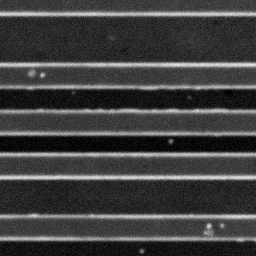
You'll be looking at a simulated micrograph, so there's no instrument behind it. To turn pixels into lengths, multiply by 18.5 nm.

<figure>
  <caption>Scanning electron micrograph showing lines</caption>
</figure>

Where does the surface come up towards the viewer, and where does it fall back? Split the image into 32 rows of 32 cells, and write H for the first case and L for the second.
HHHHHHHHHHHHHHHHHHHHHHHHHHHHHHHH
HHHHHHHHHHHHHHHHHHHHHHHHHHHHHHHH
LLLLLLLLLLLLLLLLLLLLLLLLLLLLLLLL
LLLLLLLLLLLLLLLLLLLLLLLLLLLLLLLL
LLLLLLLLLLLLLLLLLLLLLLLLLLLLLLLL
LLLLLLLLLLLLLLLLLLLLLLLLLLLLLLLL
LLLLLLLLLLLLLLLLLLLLLLLLLLLLLLLL
LLLLLLLLLLLLLLLLLLLLLLLLLLLLLLLL
HHHHHHHHHHHHHHHHHHHHHHHHHHHHHHHH
HHHHHHHHHHHHHHHHHHHHHHHHHHHHHHHH
HHHHHHHHHHHHHHHHHHHHHHHHHHHHHHHH
LLLLLLLLLLLLLLLLLLLLLLLLLLLLLLLL
LLLLLLLLLLLLLLLLLLLLLLLLLLLLLLLL
LLLLLLLLLLLLLLLLLLLLLLLLLLLLLLLL
HHHHHHHHHHHHHHHHHHHHHHHHHHHHHHHH
HHHHHHHHHHHHHHHHHHHHHHHHHHHHHHHH
HHHHHHHHHHHHHHHHHHHHHHHHHHHHHHHH
LLLLLLLLLLLLLLLLLLLLLLLLLLLLLLLL
LLLLLLLLLLLLLLLLLLLLLLLLLLLLLLLL
HHHHHHHHHHHHHHHHHHHHHHHHHHHHHHHH
HHHHHHHHHHHHHHHHHHHHHHHHHHHHHHHH
HHHHHHHHHHHHHHHHHHHHHHHHHHHHHHHH
LLLLLLLLLLLLLLLLLLLLLLLLLLLLLLLL
LLLLLLLLLLLLLLLLLLLLLLLLLLLLLLLL
LLLLLLLLLLLLLLLLLLLLLLLLLLLLLLLL
LLLLLLLLLLLLLLLLLLLLLLLLLLLLLLLL
LLLLLLLLLLLLLLLLLLLLLLLLLLLLLLLL
HHHHHHHHHHHHHHHHHHHHHHHHHHHHHHHH
HHHHHHHHHHHHHHHHHHHHHHHHHHHHHHHH
HHHHHHHHHHHHHHHHHHHHHHHHHHHHHHHH
LLLLLLLLLLLLLLLLLLLLLLLLLLLLLLLL
LLLLLLLLLLLLLLLLLLLLLLLLLLLLLLLL